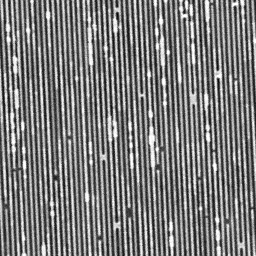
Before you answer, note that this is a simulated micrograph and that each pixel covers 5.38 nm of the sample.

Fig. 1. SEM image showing parallel lines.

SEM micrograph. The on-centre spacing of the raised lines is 27.5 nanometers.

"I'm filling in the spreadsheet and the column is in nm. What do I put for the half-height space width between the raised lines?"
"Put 18.1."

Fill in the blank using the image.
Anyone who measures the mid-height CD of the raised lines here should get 9.4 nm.